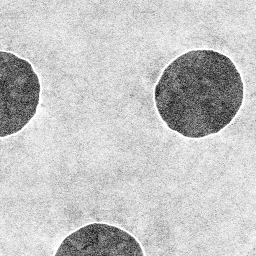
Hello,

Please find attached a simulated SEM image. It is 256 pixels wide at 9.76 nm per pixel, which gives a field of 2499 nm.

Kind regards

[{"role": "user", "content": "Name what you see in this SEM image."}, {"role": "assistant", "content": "raised bodies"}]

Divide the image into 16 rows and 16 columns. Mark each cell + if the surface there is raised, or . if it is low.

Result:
................
................
................
+..........+++..
++........+++++.
+++.......+++++.
++........+++++.
++........+++++.
+..........++...
................
................
................
................
................
....++++........
....+++++.......